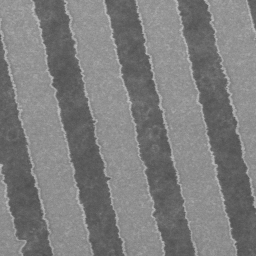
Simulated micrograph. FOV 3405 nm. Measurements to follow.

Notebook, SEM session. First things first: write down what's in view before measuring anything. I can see one or a few lines or trenches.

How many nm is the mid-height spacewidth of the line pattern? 403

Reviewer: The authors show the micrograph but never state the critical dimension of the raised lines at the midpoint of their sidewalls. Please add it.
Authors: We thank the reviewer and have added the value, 518 nanometres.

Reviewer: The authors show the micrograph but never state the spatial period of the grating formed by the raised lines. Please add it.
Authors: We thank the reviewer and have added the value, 923 nm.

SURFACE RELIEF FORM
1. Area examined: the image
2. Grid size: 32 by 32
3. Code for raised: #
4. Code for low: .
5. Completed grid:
####....#####....#####....#####.
####....#####....#####....#####.
#####....#####....#####...#####.
#####....#####....#####....#####
#####....#####....#####....#####
#####....#####....#####....#####
.#####....#####...#####....#####
.#####....#####....#####....####
.#####....#####....#####....####
.#####....#####....#####....####
..####.....#####...#####....####
..#####....#####....#####....###
..#####....#####....#####....###
..#####....#####....#####....###
..#####.....####....#####....###
...#####....#####....#####....##
...#####....#####....#####....##
...#####....#####....#####....##
....#####...#####....#####....##
....#####....####....######...##
....#####....#####....#####....#
....#####....#####....#####....#
....#####.....####....#####....#
#....#####....#####....####....#
#....#####....#####....#####....
#....#####....#####....#####....
#....#####....#####....#####....
##....#####....####....######...
##....#####....#####....#####...
##....#####....#####....#####...
###...#####....#####....#####...
###....####....#####....######..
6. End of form